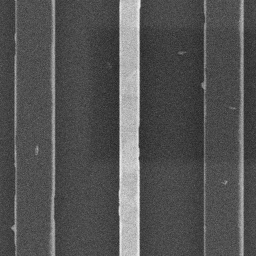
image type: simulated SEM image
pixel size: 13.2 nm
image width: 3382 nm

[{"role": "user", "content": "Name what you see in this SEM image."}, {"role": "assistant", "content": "lines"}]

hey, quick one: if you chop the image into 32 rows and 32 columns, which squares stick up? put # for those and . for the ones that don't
..#####........##.........####..
..#####........##.........####..
..#####........##.........####..
..#####........##.........####..
..#####........##.........####..
..#####........##.........####..
..#####........##.........####..
..#####........##.........####..
..#####........##.........####..
..#####........##.........####..
..#####........##.........####..
..#####........##.........####..
..#####........##.........####..
..#####........##.........####..
..#####........##.........####..
..#####........##.........####..
..#####........##.........####..
..#####........##.........####..
..#####........##.........####..
..#####........##.........####..
..#####........##.........####..
..#####........##.........####..
..#####........##.........####..
..#####........##.........####..
..#####........##.........####..
..#####........##.........####..
..#####........##.........####..
..#####........##.........####..
..#####........##.........####..
..#####........##.........####..
..#####........##.........####..
..#####........##.........####..